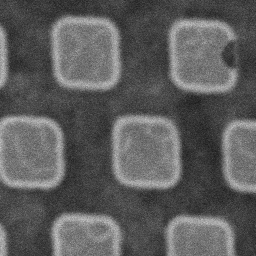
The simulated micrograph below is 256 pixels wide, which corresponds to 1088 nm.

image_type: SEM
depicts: raised bodies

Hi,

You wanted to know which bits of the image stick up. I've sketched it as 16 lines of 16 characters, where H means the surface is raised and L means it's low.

LLLLLLLLLLLLLLLL
LLLLHHHLLLLHHHLL
LLLHHHHLLLLHHHLL
LLLHHHHLLLLHHHLL
LLLLHHHLLLLHHHHL
LLLLLLLLLLLLHHLL
LLLLLLLLLLLLLLLL
HHHLLLLLHHLLLLLL
HHHHLLLHHHHLLLHH
HHHHLLLHHHHLLLHH
HHHHLLLHHHHLLLHH
LHHLLLLLHHHLLLHH
LLLLLLLLLLLLLLLL
LLLLHLLLLLLLLLLL
LLLHHHHLLLLHHHLL
LLLHHHHLLLLHHHHL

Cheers